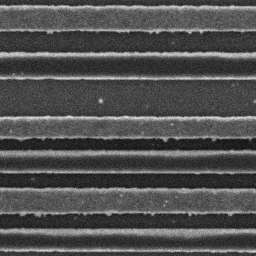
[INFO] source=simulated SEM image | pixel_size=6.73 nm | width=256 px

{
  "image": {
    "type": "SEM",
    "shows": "lines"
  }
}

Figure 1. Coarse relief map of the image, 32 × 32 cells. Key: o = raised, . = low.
................................
oooooooooooooooooooooooooooooooo
oooooooooooooooooooooooooooooooo
oooooooooooooooooooooooooooooooo
................................
................................
................................
oooooooooooooooooooooooooooooooo
oooooooooooooooooooooooooooooooo
oooooooooooooooooooooooooooooooo
................................
................................
................................
................................
................................
oooooooooooooooooooooooooooooooo
oooooooooooooooooooooooooooooooo
................................
................................
oooooooooooooooooooooooooooooooo
oooooooooooooooooooooooooooooooo
oooooooooooooooooooooooooooooooo
................................
................................
oooooooooooooooooooooooooooooooo
oooooooooooooooooooooooooooooooo
oooooooooooooooooooooooooooooooo
................................
................................
oooooooooooooooooooooooooooooooo
oooooooooooooooooooooooooooooooo
................................